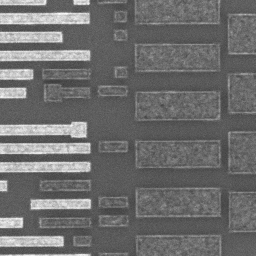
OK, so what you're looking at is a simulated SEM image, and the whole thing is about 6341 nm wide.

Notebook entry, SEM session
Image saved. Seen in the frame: wiring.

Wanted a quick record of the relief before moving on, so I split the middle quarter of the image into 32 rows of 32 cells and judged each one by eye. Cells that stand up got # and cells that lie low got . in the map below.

..................##############
######.......###..##############
######.......###................
######..........................
................................
................................
######...#######................
######...#######..##############
..................##############
..................##############
..................##############
..................##############
..................##############
..................##############
................................
#####...........................
#####...........................
#####...........................
................................
..................##############
######...#######..##############
######...#######..##############
..................##############
..................##############
..................##############
######............##############
######..........................
................................
................................
######..........................
######..........................
..................##############